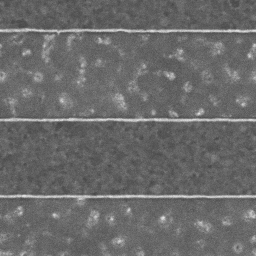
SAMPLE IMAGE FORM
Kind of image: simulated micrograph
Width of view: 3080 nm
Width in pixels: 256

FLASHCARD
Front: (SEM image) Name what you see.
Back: one or a few lines or trenches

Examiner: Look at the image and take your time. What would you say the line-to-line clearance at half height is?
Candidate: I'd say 88.9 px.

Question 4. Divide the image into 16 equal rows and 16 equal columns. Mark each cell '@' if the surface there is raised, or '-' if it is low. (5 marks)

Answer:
@@@@@@@@@@@@@@@@
@@@@@@@@@@@@@@@@
----------------
----------------
----------------
----------------
----------------
@@--@@@@@@@-@@@@
@@@@@@@@@@@@@@@@
@@@@@@@@@@@@@@@@
@@@@@@@@@@@@@@@@
@@@@@@@@@@@@@@@@
----------------
----------------
----------------
----------------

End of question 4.